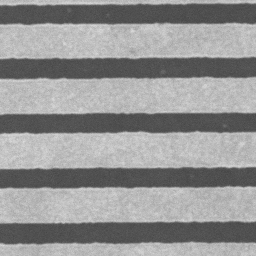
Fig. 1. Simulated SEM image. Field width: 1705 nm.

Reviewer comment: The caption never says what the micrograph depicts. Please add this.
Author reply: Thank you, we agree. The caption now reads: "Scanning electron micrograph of lines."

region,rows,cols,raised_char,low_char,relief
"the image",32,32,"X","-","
XX--XXX-------------------------
--------------------------------
--------------------------------
XXXXXXXXXXXXXXXXXXXXXXXXXXXXXXXX
XXXXXXXXXXXXXXXXXXXXXXXXXXXXXXXX
XXXXXXXXXXXXXXXXXXXXXXXXXXXXXXXX
XXXXXXXXXXXXXXXXXXXXXXXXXXXXXXXX
--------------------------------
--------------------------------
--------------------------------
XXXXXXXXXXXXXXXXXXXXXXXXXXXXXXXX
XXXXXXXXXXXXXXXXXXXXXXXXXXXXXXXX
XXXXXXXXXXXXXXXXXXXXXXXXXXXXXXXX
XXXXXXXXXXXXXXXXXXXXXXXXXXXXXXXX
--------------------------------
--------------------------------
---------------X--------X-------
XXXXXXXXXXXXXXXXXXXXXXXXXXXXXXXX
XXXXXXXXXXXXXXXXXXXXXXXXXXXXXXXX
XXXXXXXXXXXXXXXXXXXXXXXXXXXXXXXX
XXXXXXXXXXXXXXXXXXXXXXXXXXXXXXXX
--------------------------------
--------------------------------
----------------------------XXXX
XXXXXXXXXXXXXXXXXXXXXXXXXXXXXXXX
XXXXXXXXXXXXXXXXXXXXXXXXXXXXXXXX
XXXXXXXXXXXXXXXXXXXXXXXXXXXXXXXX
XXXXXXXXXXXXXXXXXXXXXXXXXXXXXXXX
--------------------------------
--------------------------------
-------X-X-XX----XXXXXXXXXXXXXXX
XXXXXXXXXXXXXXXXXXXXXXXXXXXXXXXX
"